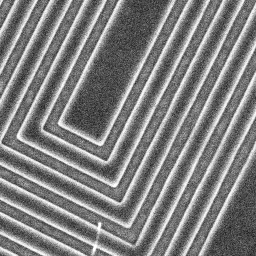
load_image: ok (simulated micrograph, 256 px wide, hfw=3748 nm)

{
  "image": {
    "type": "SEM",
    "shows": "groups of lines, slits or small figures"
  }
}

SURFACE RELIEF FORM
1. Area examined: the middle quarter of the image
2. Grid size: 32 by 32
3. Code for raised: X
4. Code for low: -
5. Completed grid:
XX----XXXXXXXXXXXXX----XXXXX----
XX---XXXXXXXXXXXXXX---XXXXXX---X
X----XXXXXXXXXXXXX----XXXXX----X
X---XXXXXXXXXXXXXX---XXXXXX---XX
----XXXXXXXXXXXXX----XXXXX----XX
---XXXXXXXXXXXXXX---XXXXXX---XXX
---XXXXXXXXXXXXX----XXXXX----XXX
--XXXXXXXXXXXXXX---XXXXX----XXXX
--XXXXXXXXXXXXX----XXXXX----XXXX
-XXXXXXXXXXXXXX---XXXXXX---XXXXX
-XXXXXXXXXXXXX----XXXXX----XXXXX
XXXXXXXXXXXXXX---XXXXXX---XXXXX-
XXXXXXXXXXXXX----XXXXX----XXXXX-
XXXXXXXXXXXXX---XXXXX----XXXXX--
XXXXXXXXXXXX----XXXXX----XXXXX--
XXXXXXXXXXXX---XXXXXX---XXXXX---
-XXXXXXXXXX----XXXXX----XXXXX---
---XXXXXXXX---XXXXXX---XXXXX----
-----XXXXX----XXXXX----XXXXX---X
X------XXX---XXXXXX---XXXXX----X
XX-----------XXXXX----XXXXX---XX
XXXXX-------XXXXXX---XXXXX----XX
XXXXXXX-----XXXXX----XXXXX---XXX
XXXXXXXX---XXXXXX---XXXXX----XXX
XXXXXXXXXXXXXXXX----XXXXX---XXXX
--XXXXXXXXXXXXXX---XXXXX----XXXX
----XXXXXXXXXXX---XXXXXX---XXXXX
------XXXXXXXXX---XXXXX----XXXXX
X-------XXXXXX----XXXXX---XXXXX-
XXX-------XXXX---XXXXX----XXXXX-
XXXXX-------X----XXXXX---XXXXX--
XXXXXXX---------XXXXX----XXXXX--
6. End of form